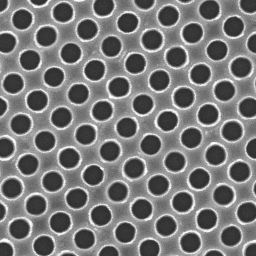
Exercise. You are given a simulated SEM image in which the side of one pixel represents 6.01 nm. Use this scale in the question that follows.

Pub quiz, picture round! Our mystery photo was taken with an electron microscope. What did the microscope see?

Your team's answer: a regular array of holes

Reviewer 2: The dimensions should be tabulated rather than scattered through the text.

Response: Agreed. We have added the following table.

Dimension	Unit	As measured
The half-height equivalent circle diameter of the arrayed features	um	0.12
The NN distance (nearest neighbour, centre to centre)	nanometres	173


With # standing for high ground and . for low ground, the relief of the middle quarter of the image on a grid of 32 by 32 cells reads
#####.....#####.....#######..###
#####.....######....############
#####.....############....######
######...####..#######....######
############....#####.....######
##...######.....######....######
#.....#####.....#######..###....
#.....######....############....
#.....############....#####.....
##...###...######.....######....
#######.....#####.....#######..#
.######.....######....##########
..#####.....#######.####....####
..######...####..#######....####
..############....#####.....####
.###...######.....######....####
###.....#####.....#######..###..
###.....######....############..
###.....############....#####...
###....####.#######.....#####...
#########.....#####.....######..
...######.....#####.....########
....#####.....#######..###...###
....######...############.....##
....############....#####.....##
...####.#######.....#####.....##
#####....######.....######...###
#####.....#####.....############
#####.....#######.####....#####.
#####....####.#######.....#####.
############....#####.....######
##...######.....#####.....######